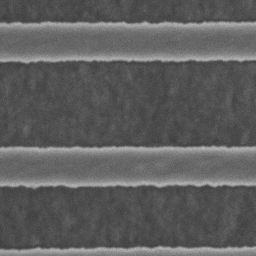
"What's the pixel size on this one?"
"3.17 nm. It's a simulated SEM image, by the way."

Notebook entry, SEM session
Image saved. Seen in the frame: lines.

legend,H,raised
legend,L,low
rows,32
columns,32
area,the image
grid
LLLLLLLLLLLLLLLLLLLLLLLLLLLLLLLL
LLLLLLLLLLLLLLLLLLLLLLLLLLLLLLLL
LLLLLLLLLLLLLLLLLLLLLLLLLLLLLLLL
HHHHHHHHHHHHHHHHHHHHHHHHHHHHHHHH
HHHHHHHHHHHHHHHHHHHHHHHHHHHHHHHH
HHHHHHHHHHHHHHHHHHHHHHHHHHHHHHHH
HHHHHHHHHHHHHHHHHHHHHHHHHHHHHHHH
HHHHHHHHHHHHHHLHHHHLHHHHHHHLHHHH
LLLLLLLLLLLLLLLLLLLLLLLLLLLLLLLL
LLLLLLLLLLLLLLLLLLLLLLLLLLLLLLLL
LLLLLLLLLLLLLLLLLLLLLLLLLLLLLLLL
LLLLLLLLLLLLLLLLLLLLLLLLLLLLLLLL
LLLLLLLLLLLLLLLLLLLLLLLLLLLLLLLL
LLLLLLLLLLLLLLLLLLLLLLLLLLLLLLLL
LLLLLLLLLLLLLLLLLLLLLLLLLLLLLLLL
LLLLLLLLLLLLLLLLLLLLLLLLLLLLLLLL
LLLLLLLLLLLLLLLLLLLLLLLLLLLLLLLL
LLLLLLLLLLLLLLLLLLLLLLLLLLLLLLLL
HHHLHLLLLHLHLHHHHHHLHHHHHHHHHHHH
HHHHHHHHHHHHHHHHHHHHHHHHHHHHHHHH
HHHHHHHHHHHHHHHHHHHHHHHHHHHHHHHH
HHHHHHHHHHHHHHHHHHHHHHHHHHHHHHHH
HHHHHHHHHHHHHHHHHHHHHHHHHHHHHHHH
LLLLLLLLLLLLLLLLLLLLLLLLLLLLLLLL
LLLLLLLLLLLLLLLLLLLLLLLLLLLLLLLL
LLLLLLLLLLLLLLLLLLLLLLLLLLLLLLLL
LLLLLLLLLLLLLLLLLLLLLLLLLLLLLLLL
LLLLLLLLLLLLLLLLLLLLLLLLLLLLLLLL
LLLLLLLLLLLLLLLLLLLLLLLLLLLLLLLL
LLLLLLLLLLLLLLLLLLLLLLLLLLLLLLLL
LLLLLLLLLLLLLLLLLLLLLLLLLLLLLLLL
HHHHHHHHHHHHHHHHHHHHHHHHHHHHHHHH